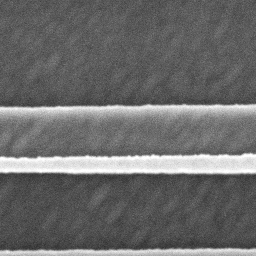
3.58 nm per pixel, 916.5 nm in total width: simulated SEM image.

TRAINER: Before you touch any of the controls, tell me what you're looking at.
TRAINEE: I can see lines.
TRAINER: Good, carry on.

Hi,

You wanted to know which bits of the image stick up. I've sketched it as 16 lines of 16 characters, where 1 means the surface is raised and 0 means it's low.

0000000000000000
0000000000000000
0000000000000000
0000000000000000
0000000000000000
0000000000000000
0000000000000000
1111111111111111
1111111111111111
1111111111111111
1111111111111111
0000000000000000
0000000000000000
0000000000000000
0000000000000000
0000000000000000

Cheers